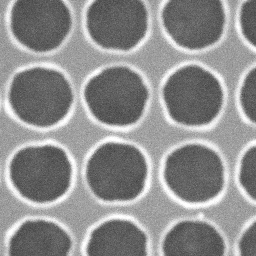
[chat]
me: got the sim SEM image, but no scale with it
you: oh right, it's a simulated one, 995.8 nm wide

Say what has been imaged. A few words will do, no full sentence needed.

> holes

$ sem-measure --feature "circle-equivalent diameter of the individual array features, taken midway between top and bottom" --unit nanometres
245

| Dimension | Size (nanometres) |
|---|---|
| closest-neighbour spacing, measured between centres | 296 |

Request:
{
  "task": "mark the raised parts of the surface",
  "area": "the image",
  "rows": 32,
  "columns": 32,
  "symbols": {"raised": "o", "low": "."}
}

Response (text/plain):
oo......ooo.......ooo.......oo..
o........oo.......oo........oo..
o........oo........o........oo..
o........oo.......ooo.......oo..
oo......ooo.......ooo.......oo..
ooo.....oooo.....ooooo.....oooo.
oooo..oooooooooooooooooooooooooo
oooooooooooooooooooooooooooooooo
oooo...oooooo...oooooo...oooooo.
oo......oooo......ooo......oooo.
o........oo.......ooo.......oo..
o........o.........o........oo..
o........oo........o........oo..
o........oo.......ooo.......oo..
oo......ooo.......ooo......oooo.
ooo....oooooo....ooooo....oooooo
oooooooooooooooooooooooooooooooo
oooooooooooooooooooooooooooooooo
ooo.....oooo.....ooooo....ooooo.
oo......ooo.......ooo......ooo..
o........oo........oo.......oo..
o........oo.......oo........oo..
o........oo.......oo........oo..
oo.......oo.......ooo.......oo..
ooo.....oooo.....ooooo.....oooo.
ooooo.oooooooooooooooooooooooooo
oooooooooooooooooooooooooooooooo
oooo..oooooooo..oooooooooooooooo
oo......oooo.....oooo......oooo.
o........oo.......ooo.......oo..
o........oo........o........oo..
o........oo........o........oo..